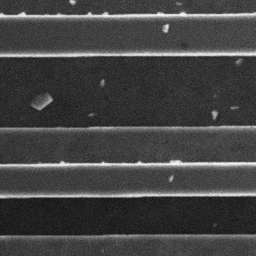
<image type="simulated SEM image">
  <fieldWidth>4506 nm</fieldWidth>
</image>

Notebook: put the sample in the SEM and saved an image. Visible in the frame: lines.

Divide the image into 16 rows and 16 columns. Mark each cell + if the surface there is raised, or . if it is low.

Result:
++++++++++++++++
++++++++++++++++
++++++++++++++++
++++............
................
................
................
................
++++++++++++++++
++++++++++++++++
++++++++++++++++
++++++++++++++++
................
................
................
++++++++++++++++